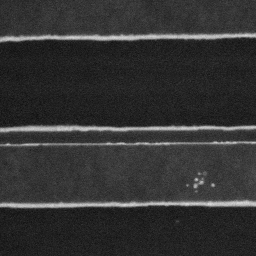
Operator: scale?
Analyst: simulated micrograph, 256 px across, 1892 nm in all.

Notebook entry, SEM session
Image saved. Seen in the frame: lines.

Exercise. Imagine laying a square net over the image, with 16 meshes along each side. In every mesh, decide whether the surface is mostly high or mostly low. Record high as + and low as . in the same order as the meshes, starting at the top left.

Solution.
++++++++++++++++
++++++++++++++++
................
................
................
................
................
................
++++++++++++++++
++++++++++++++++
++++++++++++++++
++++++++++++++++
++++++++++++++++
................
................
................